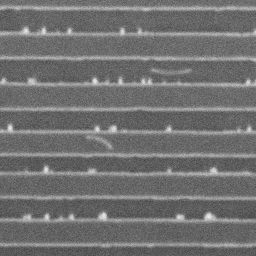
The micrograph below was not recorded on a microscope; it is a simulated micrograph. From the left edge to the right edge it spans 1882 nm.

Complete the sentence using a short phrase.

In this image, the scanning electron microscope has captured lines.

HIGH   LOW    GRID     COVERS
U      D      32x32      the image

UUUUUUUUUUUUUUUUUUUUUUUUUUUUUUUU
DDDDDDDDDDDDDDDDDDDDDDDDDDDDDDDD
DDDDDDDDDDDDDDDDDDDDDDDDDDDDDDDD
DDDDDDDDDDDDDDDDDDDDDDDDDDDDDDDD
UUUUUUUUUUUUUUUUUUUUUUUUUUUUUUUU
UUUUUUUUUUUUUUUUUUUUUUUUUUUUUUUU
UUUUUUUUUUUUUUUUUUUUUUUUUUUUUUUU
DDDDDDDDDDDDDDDDDDDDDDDDDDDDDDDU
DDDDDDDDDDDDDDDDDDDDDDDDDDDDDDDD
DDDDDDDDDDDDDDDDDDDDDDDDDDDDDDDD
UUUDUDDUDDUUUUDDDDDDDDDDDDDDDDDD
UUUUUUUUUUUUUUUUUUUUUUUUUUUUUUUU
UUUUUUUUUUUUUUUUUUUUUUUUUUUUUUUU
UUUUUUUUUUUUUUUUUUUUUUUUUUUUUUUU
DDDDDDDDDDDDDDDDDDDDDDDDDDDDDDDD
DDDDDDDDDDDDDDDDDDDDDDDDDDDDDDDD
UUUUUUUUUUUUUUUUUUUUUUUUUDDDUUUU
UUUUUUUUUUUUUUUUUUUUUUUUUUUUUUUU
UUUUUUUUUUUUUUUUUUUUUUUUUUUUUUUU
DDDDDDDDDDUUDDDUUUUDUUUUDUUUUUUU
DDDDDDDDDDDDDDDDDDDDDDDDDDDDDDDD
DDDDDDDDDDDDDDDDDDDDDDDDDDDDDDDD
UUUUUUUUUUUUUUUUUUUUUUUUUUUUUUUU
UUUUUUUUUUUUUUUUUUUUUUUUUUUUUUUU
UUUUUUUUUUUUUUUUUUUUUUUUUUUUUUUU
DDDDDDDDDDDDDDDDDDDDDDDDDDDDDDDD
DDDDDDDDDDDDDDDDDDDDDDDDDDDDDDDD
UUUUUUDUUUUUUUUUUUUUUUDDDUUUDDDD
UUUUUUUUUUUUUUUUUUUUUUUUUUUUUUUU
UUUUUUUUUUUUUUUUUUUUUUUUUUUUUUUU
UUUUUUUUUUUUUUUUUUUUUUUUUUUUUUUU
DDDDDDDDDDDDDDDDDDDDDDDDDDDDDDDD